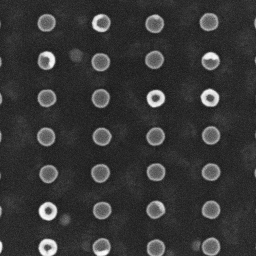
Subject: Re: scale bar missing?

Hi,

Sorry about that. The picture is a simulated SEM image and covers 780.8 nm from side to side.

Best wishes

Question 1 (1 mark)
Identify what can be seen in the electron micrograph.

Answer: a regular array of raised bodies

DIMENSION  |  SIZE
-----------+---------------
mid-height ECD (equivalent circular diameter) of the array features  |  53 nm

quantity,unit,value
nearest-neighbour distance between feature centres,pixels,37